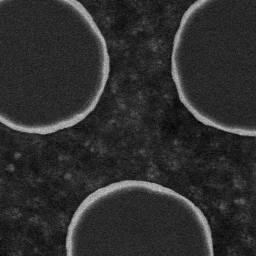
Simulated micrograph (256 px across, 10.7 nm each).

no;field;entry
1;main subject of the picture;raised bodies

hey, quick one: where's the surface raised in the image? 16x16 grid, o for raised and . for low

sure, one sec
ooooo.......oooo
oooooo.....ooooo
ooooooo....ooooo
ooooooo....ooooo
ooooooo....ooooo
oooooo.....ooooo
oooooo......oooo
ooooo........ooo
................
................
................
.......oo.......
......oooooo....
.....oooooooo...
....ooooooooo...
....ooooooooo...